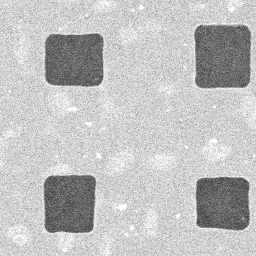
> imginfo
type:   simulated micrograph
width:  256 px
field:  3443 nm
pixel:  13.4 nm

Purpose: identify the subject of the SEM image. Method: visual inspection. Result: holes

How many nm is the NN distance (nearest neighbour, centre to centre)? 1950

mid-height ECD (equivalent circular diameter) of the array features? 0.822 microns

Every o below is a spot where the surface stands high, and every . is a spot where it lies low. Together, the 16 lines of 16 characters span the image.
oooooooooooooooo
oooooooooooooooo
ooo...oooooo....
ooo...oooooo....
ooo...oooooo....
ooooooooooooo..o
oooooooooooooooo
oooooooooooooooo
oooooooooooooooo
oooooooooooooooo
oooooooooooooooo
ooo...oooooo...o
ooo...oooooo....
ooo...oooooo....
ooo..ooooooooooo
oooooooooooooooo